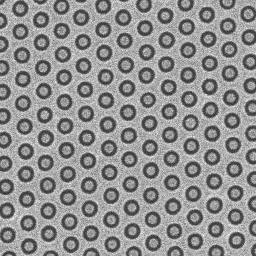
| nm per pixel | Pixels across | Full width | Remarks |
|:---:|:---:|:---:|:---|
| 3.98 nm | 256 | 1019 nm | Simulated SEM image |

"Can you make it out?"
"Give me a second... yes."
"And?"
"a regular array of ring-shaped grooves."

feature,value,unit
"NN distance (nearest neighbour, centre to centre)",92.4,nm